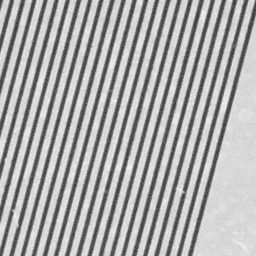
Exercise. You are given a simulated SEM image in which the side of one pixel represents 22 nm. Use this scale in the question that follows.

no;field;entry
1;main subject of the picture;parallel lines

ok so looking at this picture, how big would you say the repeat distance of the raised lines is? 238 nanometers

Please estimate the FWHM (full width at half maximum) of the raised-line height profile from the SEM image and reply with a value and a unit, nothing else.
125 nanometers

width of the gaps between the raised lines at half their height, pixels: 5.2